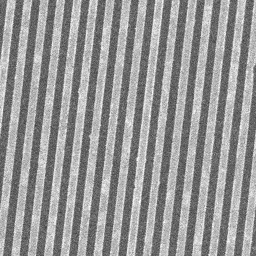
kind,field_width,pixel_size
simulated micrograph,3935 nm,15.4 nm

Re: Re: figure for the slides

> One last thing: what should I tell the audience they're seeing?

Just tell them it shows parallel lines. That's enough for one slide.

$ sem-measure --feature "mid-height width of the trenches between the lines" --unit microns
0.137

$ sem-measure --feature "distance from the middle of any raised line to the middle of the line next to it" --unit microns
0.251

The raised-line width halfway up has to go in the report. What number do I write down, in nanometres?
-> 120